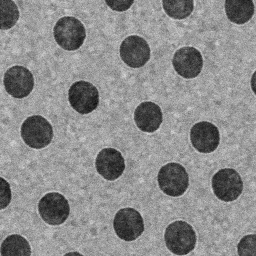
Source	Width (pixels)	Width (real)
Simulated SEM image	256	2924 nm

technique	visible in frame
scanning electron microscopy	a regular array of holes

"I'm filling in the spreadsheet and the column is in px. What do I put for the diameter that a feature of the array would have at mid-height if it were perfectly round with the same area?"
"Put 33.5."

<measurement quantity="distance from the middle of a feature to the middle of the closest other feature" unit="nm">617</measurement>